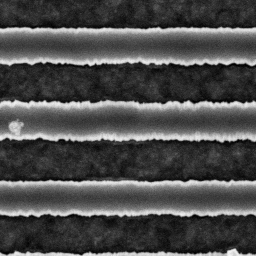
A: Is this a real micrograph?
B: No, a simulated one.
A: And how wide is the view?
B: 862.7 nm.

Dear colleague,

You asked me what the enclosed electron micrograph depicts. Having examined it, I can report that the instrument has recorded lines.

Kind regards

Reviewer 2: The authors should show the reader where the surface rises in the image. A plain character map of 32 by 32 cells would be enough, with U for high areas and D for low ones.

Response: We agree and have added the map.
DDDDDDDDDDDDDDDDDDDDDDDDDDDDDDDD
DDDDDDDDDDDDDDDDDDDDDDDDDDDDDDDD
DDDDDDDDDDDDDDDDDDDDDDDDDDDDDDDD
DUUUDUDUDDUDDUDDDDDUDUUUUUDUUDDU
UUUUUUUUUUUUUUUUUUUUUUUUUUUUUUUU
UUUUUUUUUUUUUUUUUUUUUUUUUUUUUUUU
UUUUUUUUUUUUUUUUUUUUUUUUUUUUUUUU
UUUUUUUUUUUUUUUUUUUUUUUUUUUUUUUU
DDDDDDDDDDDDDDDDDDDDDDDDDDDDDDDD
DDDDDDDDDDDDDDDDDDDDDDDDDDDDDDDD
DDDDDDDDDDDDDDDDDDDDDDDDDDDDDDDD
DDDDDDDDDDDDDDDDDDDDDDDDDDDDDDDD
DDDDDDDDDDDDDDDDDDDDDDDDDDDDDDDD
UUUUUUUUUUUUUUUUUUUUUUUUUUUUUUUU
UUUUUUUUUUUUUUUUUUUUUUUUUUUUUUUU
UUUUUUUUUUUUUUUUUUUUUUUUUUUUUUUU
UUUUUUUUUUUUUUUUUUUUUUUUUUUUUUUU
DDDDDDUDDUUUDDUUDUDDDDUUUDDUUUDU
DDDDDDDDDDDDDDDDDDDDDDDDDDDDDDDD
DDDDDDDDDDDDDDDDDDDDDDDDDDDDDDDD
DDDDDDDDDDDDDDDDDDDDDDDDDDDDDDDD
DDDDDDDDDDDDDDDDDDDDDDDDDDDDDDDD
DDDDDDDDDDDDDDDDDDDDDDDDDDDDDDDD
UUUUUUUUUUUUUUUUUUUUUUUUUUUUUUUU
UUUUUUUUUUUUUUUUUUUUUUUUUUUUUUUU
UUUUUUUUUUUUUUUUUUUUUUUUUUUUUUUU
UUUUUUUUUUUUUUUUUUUUUUUUUUUUUUUU
DDDDDDDDDDDDDDDDDDDDDDDDDDDDDDDD
DDDDDDDDDDDDDDDDDDDDDDDDDDDDDDDD
DDDDDDDDDDDDDDDDDDDDDDDDDDDDDDDD
DDDDDDDDDDDDDDDDDDDDDDDDDDDDDDDD
DDDDDDDDDDDDDDDDDDDDDDDDDDDDUUDD